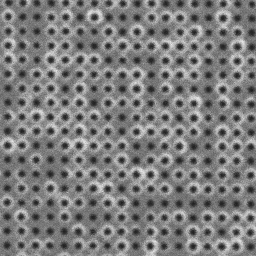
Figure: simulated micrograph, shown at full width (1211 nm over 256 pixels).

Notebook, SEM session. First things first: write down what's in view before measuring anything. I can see a regular array of holes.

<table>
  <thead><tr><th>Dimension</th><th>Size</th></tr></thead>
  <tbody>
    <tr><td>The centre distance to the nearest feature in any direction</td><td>0.0661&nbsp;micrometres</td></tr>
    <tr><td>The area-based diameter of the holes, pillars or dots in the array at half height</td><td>35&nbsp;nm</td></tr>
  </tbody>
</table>